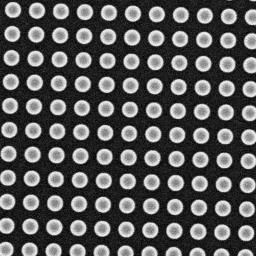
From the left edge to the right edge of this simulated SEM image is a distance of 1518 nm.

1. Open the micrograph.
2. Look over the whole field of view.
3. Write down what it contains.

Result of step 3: an array of small figures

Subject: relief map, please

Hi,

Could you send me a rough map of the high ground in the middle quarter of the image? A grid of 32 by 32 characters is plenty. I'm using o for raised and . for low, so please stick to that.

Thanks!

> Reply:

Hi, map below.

....oo...ooo...ooo...oooo..oooo.
............................o...
................................
....oo....o.....................
...oooo..ooo...ooo...ooo...ooo..
...oooo..ooo...ooo...ooo...ooo..
....oo...ooo...ooo...ooo...ooo..
............................o...
................................
...ooo....o.....................
...ooo...ooo...ooo...ooo...ooo..
...ooo...ooo...ooo...ooo...ooo..
...ooo...ooo...ooo...ooo...ooo..
............................o...
................................
...oo....oo.....................
..oooo...ooo...ooo...ooo...ooo..
..oooo...ooo..oooo..oooo..oooo..
...ooo...ooo...ooo...ooo...ooo..
............................o...
................................
...oo....oo.....................
..oooo..oooo..oooo...ooo...oo...
..oooo..oooo..oooo..oooo..oooo..
...oo....ooo...ooo..oooo..oooo..
...........................oo...
................................
...oo....oo.....................
..oooo..oooo..oooo..oooo...oo...
..oooo..oooo..oooo..oooo..oooo..
...oo....oo...ooo...oooo..oooo..
...........................oo...